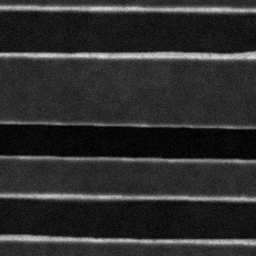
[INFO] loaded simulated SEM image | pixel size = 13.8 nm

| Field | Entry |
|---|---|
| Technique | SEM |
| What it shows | lines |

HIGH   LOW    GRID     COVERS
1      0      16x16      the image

0000011111111111
0000000000000000
0000000000000000
1111111111110001
1111111111111111
1111111111111111
1111111111111111
1111111111111111
0000000000000000
0000000000000000
1111111111111111
1111111111111111
0000000000000000
0000000000000000
0000000000000000
1111111111111111